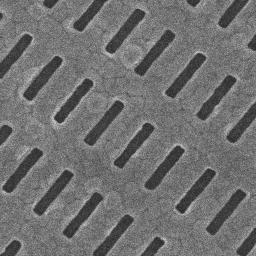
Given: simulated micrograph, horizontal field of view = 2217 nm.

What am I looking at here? a regular array of holes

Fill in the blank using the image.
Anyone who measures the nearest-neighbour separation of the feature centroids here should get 37.4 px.